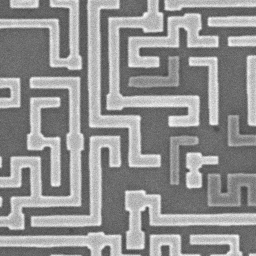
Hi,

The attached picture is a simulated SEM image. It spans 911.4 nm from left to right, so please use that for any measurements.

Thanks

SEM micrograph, wiring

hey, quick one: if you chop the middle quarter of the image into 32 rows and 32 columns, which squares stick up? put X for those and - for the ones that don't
XXXX--XXX---XX--XXXXXXXX--XXX---
------XXX---XX------------XXX---
------XXX---XX------------XXX---
XXXX--XXX---XX---XXXXXXXXXXXX---
XXXX--XXX---XX--XXXXXXXXXXXXX---
XXXX--XXX---XX---XXXXX----------
-XXX--XXX---XX------------------
--XX--XXX--XXX------------------
--XX--XXX--XXXXXXXXXXXXXXXXXXXXX
--XX--XXX--XXXXXXXXXXXXXXXXXXXXX
--XX--XXX--XXXXXXXXXXXXXXXXXXXXX
--XX--XXX----------------------X
--XX--XXX----------------------X
--XX--XXXXXXXXXXXXX-------XXXXXX
--XX--XXXXXXXXXXXXX-------XXXXXX
--XX---XXXXXXXXXXXX-------------
--XX-------------XX-------------
-XXX-------------XX-------------
-XXXX--XXXXXXX---XX--------XXXXX
-XXXX--XXXXXXX---XX--------XXXXX
-XXXX--XXXXXXX---XX--------XX---
-XXX---XX---XX---XX--------XX---
--XX--XXX---XX--XXX--------XX--X
--XX--XXX---XX--XXXXXXXX---XX--X
--XX--XXX---XX--XXXXXXXX---XX--X
--XX--XXX---XX---XXXXXXX---XX--X
--XX--XXX------------------XX--X
--XX---XX------------------XX--X
--XX---XX------------------XX--X
--XX---XX------------------XX--X
--XX---XX----------------------X
--XX---XX-----------------------